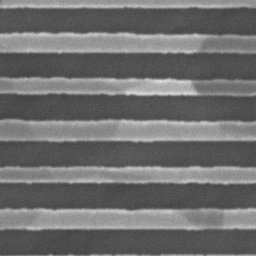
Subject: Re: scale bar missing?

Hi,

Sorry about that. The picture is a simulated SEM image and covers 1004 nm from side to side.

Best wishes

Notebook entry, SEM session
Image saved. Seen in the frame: lines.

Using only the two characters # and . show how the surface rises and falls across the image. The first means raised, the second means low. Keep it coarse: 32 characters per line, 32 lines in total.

################################
................................
................................
................................
#####################.########..
################################
...............................#
................................
................................
................................
################################
################################
................................
................................
................................
################################
################################
#######################.########
................................
................................
................................
################################
################################
................................
................................
................................
################################
################################
#############################.##
................................
................................
................................